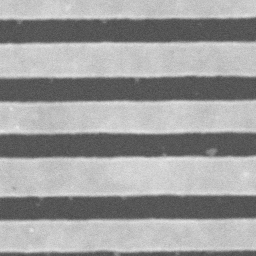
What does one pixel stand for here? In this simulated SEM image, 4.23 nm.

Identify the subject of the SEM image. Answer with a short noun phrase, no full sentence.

lines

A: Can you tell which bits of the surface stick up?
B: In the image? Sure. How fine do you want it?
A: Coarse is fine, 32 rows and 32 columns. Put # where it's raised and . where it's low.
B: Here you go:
################################
################################
................................
................................
................................
################################
################################
################################
################################
#######################..##.#.##
................................
................................
...............................#
################################
################################
################################
############################..##
................................
................................
................................
################################
################################
################################
################################
################................
................................
................................
...........#####################
################################
################################
################################
######.###....####..............